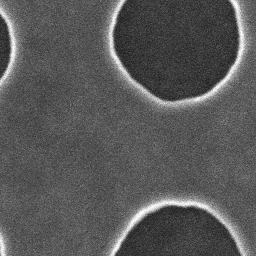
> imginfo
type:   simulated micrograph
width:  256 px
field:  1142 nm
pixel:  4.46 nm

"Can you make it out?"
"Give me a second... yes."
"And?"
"holes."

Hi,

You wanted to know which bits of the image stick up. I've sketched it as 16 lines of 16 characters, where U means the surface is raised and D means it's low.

UUUUUUUUDDDDDDDU
UUUUUUUDDDDDDDDU
DUUUUUUDDDDDDDDU
DUUUUUUDDDDDDDDU
UUUUUUUUDDDDDDUU
UUUUUUUUUDDDDUUU
UUUUUUUUUUUUUUUU
UUUUUUUUUUUUUUUU
UUUUUUUUUUUUUUUU
UUUUUUUUUUUUUUUU
UUUUUUUUUUUUUUUU
UUUUUUUUUUUUUUUU
UUUUUUUUUUUUUUUU
UUUUUUUUUDDDDUUU
UUUUUUUUDDDDDDUU
UUUUUUUDDDDDDDDU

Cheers